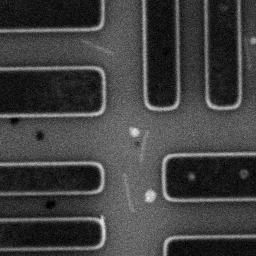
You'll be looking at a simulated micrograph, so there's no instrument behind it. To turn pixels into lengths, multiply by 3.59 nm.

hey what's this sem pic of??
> groups of lines, slits or small figures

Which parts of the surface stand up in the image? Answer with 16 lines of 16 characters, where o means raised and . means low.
oooooo...oo..oo.
oooooo...oo..oo.
.........oo..oo.
.........oo..oo.
oooooo...oo..oo.
ooooooo..oo..oo.
ooooooo..oo..oo.
................
................
................
oooooo....oooooo
oooooo....oooooo
...........ooo..
................
ooooooo.........
oooooo....oooooo